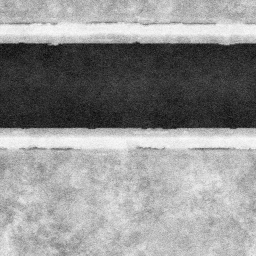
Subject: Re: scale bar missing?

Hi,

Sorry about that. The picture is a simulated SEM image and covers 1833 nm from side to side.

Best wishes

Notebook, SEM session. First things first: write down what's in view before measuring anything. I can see one or a few lines or trenches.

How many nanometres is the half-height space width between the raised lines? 805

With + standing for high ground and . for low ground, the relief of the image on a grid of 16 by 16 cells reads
++++++++++++++++
++++++++++++++++
................
................
................
................
................
................
................
++++++++++++++++
++++++++++++++++
++++++++++++++++
++++++++++++++++
++++++++++++++++
++++++++++++++++
++++++++++++++++